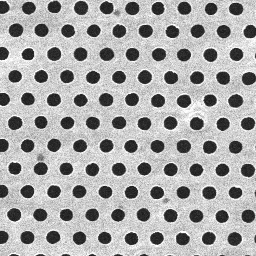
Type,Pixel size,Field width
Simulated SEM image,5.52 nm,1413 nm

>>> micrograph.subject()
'a regular array of holes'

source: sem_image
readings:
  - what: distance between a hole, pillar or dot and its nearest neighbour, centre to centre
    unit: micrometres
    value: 0.141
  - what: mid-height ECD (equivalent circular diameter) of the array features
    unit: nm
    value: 74.1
